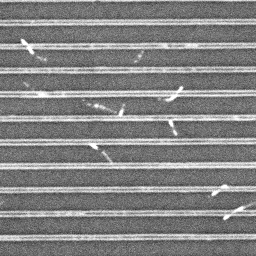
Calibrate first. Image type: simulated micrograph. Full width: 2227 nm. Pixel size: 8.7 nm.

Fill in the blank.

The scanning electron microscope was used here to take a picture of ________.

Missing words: parallel lines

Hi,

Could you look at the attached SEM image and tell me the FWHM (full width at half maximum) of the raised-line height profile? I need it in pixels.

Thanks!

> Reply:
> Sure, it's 4.75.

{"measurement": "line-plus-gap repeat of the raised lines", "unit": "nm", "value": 208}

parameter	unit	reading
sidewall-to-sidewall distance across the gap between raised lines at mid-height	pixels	19.3